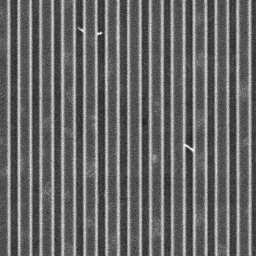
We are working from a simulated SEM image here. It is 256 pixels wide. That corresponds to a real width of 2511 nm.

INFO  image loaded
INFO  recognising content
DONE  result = parallel lines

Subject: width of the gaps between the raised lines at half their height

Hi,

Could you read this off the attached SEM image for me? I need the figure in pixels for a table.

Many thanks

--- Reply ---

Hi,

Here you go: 8.5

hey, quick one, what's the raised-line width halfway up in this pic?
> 134 nm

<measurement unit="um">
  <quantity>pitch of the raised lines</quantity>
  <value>0.215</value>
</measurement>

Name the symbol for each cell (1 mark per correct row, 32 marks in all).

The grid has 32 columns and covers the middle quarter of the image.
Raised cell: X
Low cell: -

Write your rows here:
XXX--XXX---XXX--XXX---XXX--XXX--
XXX--XXX---XXX--XXX---XXX--XXX--
XXX--XXX---XXX--XXX---XXX--XXX--
XXX--XXX---XXX--XXX---XXX--XXX--
XXX--XXX---XXX--XXX---XXX--XXX--
XXX--XXX---XXX--XXX---XXX--XXX--
XXX--XXX---XXX--XXX---XXX--XXX--
XXX--XXX---XXX--XXX---XXX--XXX--
XXX--XXX---XXX--XXX---XXX--XXX--
XXX--XXX---XXX--XXX---XXX--XXX--
XXX--XXX---XXX--XXX---XXX--XXX--
XXX--XXX---XXX--XXX---XXX--XXX--
XXX--XXX---XXX--XXX---XXX--XXX--
XXX--XXX---XXX--XXX---XXX--XXX--
XXX--XXX---XXX--XXX---XXX--XXX--
XXX--XXX---XXX--XXX---XXX--XXX--
XXX--XXX---XXX--XXX---XXX--XXX--
XXX--XXX---XXX--XXX---XXX--XXX--
XXX--XXX---XXX--XXX---XXX--XXX--
XXX--XXX---XXX--XXX---XXX--XXX--
XXX--XXX---XXX--XXX---XXX--XXXX-
XXX--XXX---XXX--XXX---XXX--XXX--
XXX--XXX---XXX--XXX---XXX--XXX--
XXX--XXX---XXX--XXX---XXX--XXX--
XXX--XXX---XXX--XXX---XXX--XXX--
XXX--XXX---XXX--XXX---XXX--XXX--
XXX--XXX---XXX--XXX---XXX--XXX--
XXX--XXX---XXX--XXX---XXX--XXX--
XXX--XXX---XXX--XXX---XXX--XXX--
XXX--XXX---XXX--XXX---XXX--XXX--
XXX--XXX---XXX--XXX---XXX--XXX--
XXX--XXX---XXX--XXX---XXX--XXX--